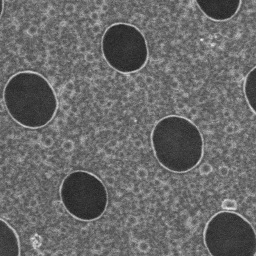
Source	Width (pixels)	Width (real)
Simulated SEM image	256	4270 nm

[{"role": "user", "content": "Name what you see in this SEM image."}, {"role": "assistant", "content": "holes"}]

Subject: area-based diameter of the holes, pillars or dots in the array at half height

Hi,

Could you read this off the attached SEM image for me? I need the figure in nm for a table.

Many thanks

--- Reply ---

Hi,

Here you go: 838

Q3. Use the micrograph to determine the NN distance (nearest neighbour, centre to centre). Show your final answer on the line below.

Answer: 1790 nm